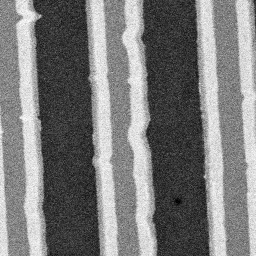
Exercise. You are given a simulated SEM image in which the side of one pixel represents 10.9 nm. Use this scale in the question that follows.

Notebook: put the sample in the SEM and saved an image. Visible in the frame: one or a few lines or trenches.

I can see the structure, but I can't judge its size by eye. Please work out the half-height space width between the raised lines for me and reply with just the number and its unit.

0.806 microns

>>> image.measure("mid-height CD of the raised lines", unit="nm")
398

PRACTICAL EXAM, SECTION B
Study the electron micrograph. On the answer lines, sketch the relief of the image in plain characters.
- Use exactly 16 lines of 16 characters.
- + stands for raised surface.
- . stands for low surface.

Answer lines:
++....++.....++.
++....++.....++.
++....++.....++.
++....++.....++.
++....+++....++.
++....+++....+++
++....+++....+++
++....+++....+++
++....++.....+++
++.....++....+++
++.....++....+++
++.....++.....++
++.....++.....++
++.....++.....++
++.....++.....++
++.....++.....++